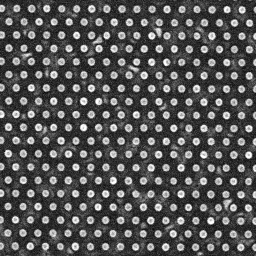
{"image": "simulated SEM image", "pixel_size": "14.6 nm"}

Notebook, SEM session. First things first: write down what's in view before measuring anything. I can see a regular array of raised bodies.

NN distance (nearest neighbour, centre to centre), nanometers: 216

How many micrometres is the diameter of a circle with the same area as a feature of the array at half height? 0.0959